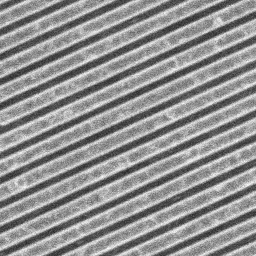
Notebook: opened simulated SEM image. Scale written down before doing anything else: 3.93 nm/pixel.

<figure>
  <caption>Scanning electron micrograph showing parallel lines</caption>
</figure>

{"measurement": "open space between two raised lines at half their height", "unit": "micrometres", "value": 0.033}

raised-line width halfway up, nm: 55.4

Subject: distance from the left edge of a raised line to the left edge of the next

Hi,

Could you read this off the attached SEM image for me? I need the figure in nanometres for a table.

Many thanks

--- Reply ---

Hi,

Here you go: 88.3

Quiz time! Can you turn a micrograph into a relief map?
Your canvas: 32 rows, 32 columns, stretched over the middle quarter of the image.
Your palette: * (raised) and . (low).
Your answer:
****.....********.....*********.
**.....********.....*********...
.....********.....*********....*
...********.....********.....***
*********....*********.....*****
******.....*********.....*******
****.....*********....*********.
**.....*********....*********...
.....********.....*********.....
...********.....*********.....**
.********.....*********.....****
*******.....********......******
*****....*********.....********.
**.....*********.....********...
.....*********....*********.....
...*********....*********.....**
.********.....*********.....****
*******.....*********.....******
*****.....*********.....********
***.....********......********..
*....*********.....********.....
...*********.....********.....**
.*********.....********.....****
********....*********.....******
*****.....*********.....********
***.....*********....*********..
*.....********.....*********....
....********.....********......*
.*********.....********.....****
*******......********.....******
*****......********.....********
***.....*********.....********..